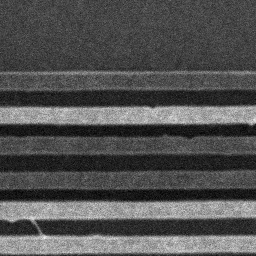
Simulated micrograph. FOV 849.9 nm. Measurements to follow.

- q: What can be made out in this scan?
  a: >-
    parallel lines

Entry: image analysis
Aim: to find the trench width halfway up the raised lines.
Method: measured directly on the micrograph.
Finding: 0.0594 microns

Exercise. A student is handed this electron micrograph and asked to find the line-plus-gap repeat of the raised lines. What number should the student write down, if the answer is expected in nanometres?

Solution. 109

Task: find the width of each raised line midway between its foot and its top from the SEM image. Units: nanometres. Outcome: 52.9